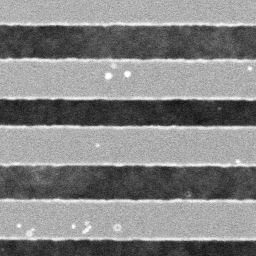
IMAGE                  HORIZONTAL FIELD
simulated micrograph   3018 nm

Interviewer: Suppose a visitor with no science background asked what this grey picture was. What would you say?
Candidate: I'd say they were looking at lines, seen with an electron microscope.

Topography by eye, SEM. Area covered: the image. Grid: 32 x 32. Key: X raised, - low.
XXXXXXXXXXXXXXXXXXXXXXXXXXXXXXXX
XXXXXXXXXXXXXXXXXXXXXXXXXXXXXXXX
XXXXXXXXXXXXXXXXXXXXXXXXXXXXXXXX
--------------------------------
--------------------------------
--------------------------------
--------------------------------
XXXXXXXXXXXXXXXXXXXXXXX-XXXXXXX-
XXXXXXXXXXXXXXXXXXXXXXXXXXXXXXXX
XXXXXXXXXXXXXXXXXXXXXXXXXXXXXXXX
XXXXXXXXXXXXXXXXXXXXXXXXXXXXXXXX
XXXXXXXXXXXXXXXXXXXXXXXXXXXXXXXX
--------------------------------
--------------------------------
--------------------------------
--------------------------------
XXXXXXXXXXXXXXXXXXXXXXXXXXXXXXXX
XXXXXXXXXXXXXXXXXXXXXXXXXXXXXXXX
XXXXXXXXXXXXXXXXXXXXXXXXXXXXXXXX
XXXXXXXXXXXXXXXXXXXXXXXXXXXXXXXX
XXXXXXXXXXXXXXXXXXXXXXXXXXXXXXXX
--------------------------------
--------------------------------
--------------------------------
--------------------------------
XXXXXXXXXXXXXXXXXXXXXXXXXXXXXXXX
XXXXXXXXXXXXXXXXXXXXXXXXXXXXXXXX
XXXXXXXXXXXXXXXXXXXXXXXXXXXXXXXX
XXXXXXXXXXXXXXXXXXXXXXXXXXXXXXXX
XXXXXXXXXXXXXXXXXXXXXXXXXXXXXXXX
--------------------------------
--------------------------------